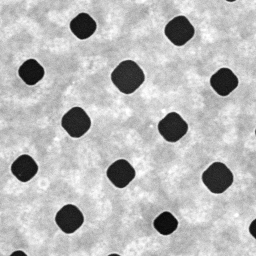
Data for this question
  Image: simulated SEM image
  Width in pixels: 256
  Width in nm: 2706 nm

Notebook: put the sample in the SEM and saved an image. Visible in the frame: a regular array of holes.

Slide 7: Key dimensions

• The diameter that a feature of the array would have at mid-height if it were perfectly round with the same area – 0.297 microns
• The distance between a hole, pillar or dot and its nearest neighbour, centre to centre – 714 nm